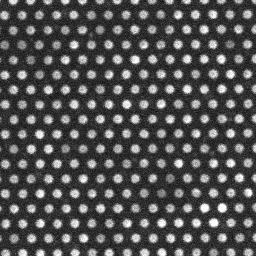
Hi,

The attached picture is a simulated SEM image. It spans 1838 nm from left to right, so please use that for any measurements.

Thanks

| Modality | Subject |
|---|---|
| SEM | a regular array of raised bodies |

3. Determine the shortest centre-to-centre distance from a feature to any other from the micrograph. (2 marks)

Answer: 122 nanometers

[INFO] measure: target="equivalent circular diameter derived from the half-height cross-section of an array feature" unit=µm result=0.055